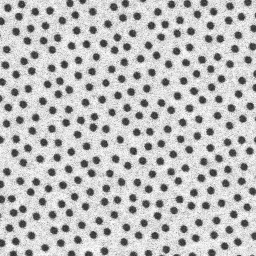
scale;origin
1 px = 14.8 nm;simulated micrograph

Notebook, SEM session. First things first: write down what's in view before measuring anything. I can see a regular array of holes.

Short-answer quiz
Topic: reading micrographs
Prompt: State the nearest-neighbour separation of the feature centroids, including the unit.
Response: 206 nm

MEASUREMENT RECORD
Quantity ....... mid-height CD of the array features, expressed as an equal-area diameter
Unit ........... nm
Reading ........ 115